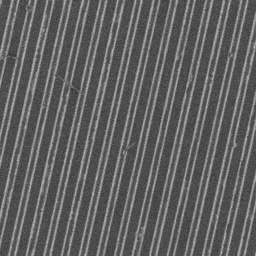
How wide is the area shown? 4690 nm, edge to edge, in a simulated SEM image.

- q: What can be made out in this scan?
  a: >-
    parallel lines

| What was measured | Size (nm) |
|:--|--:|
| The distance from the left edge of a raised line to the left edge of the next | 315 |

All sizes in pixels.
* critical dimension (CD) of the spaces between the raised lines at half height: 11.5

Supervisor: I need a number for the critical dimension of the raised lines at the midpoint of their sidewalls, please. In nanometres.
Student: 114